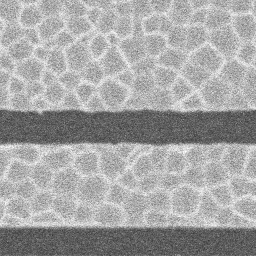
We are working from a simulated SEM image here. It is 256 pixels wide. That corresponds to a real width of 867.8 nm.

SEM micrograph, one or a few lines or trenches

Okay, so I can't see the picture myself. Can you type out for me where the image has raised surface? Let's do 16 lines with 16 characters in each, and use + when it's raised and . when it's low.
++++++++++++++++
++++++++++++++++
++++++++++++++++
++++++++++++++++
++++++++++++++++
++++++++++++++++
++++++++++++++++
................
................
++++++++++++++++
++++++++++++++++
++++++++++++++++
++++++++++++++++
++++++++++++++++
................
................